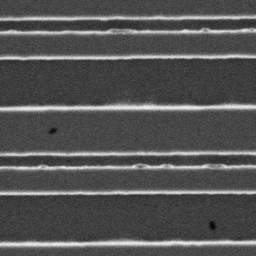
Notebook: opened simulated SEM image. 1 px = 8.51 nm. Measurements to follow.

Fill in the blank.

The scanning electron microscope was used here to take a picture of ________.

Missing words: lines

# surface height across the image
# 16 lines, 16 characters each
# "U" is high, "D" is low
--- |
UUUUUUUUUUUUUUUU
UUUUUUUUUUUUUUUU
UUUUUUUUUUUUUUUU
UUUUUUUUUUUUUUUU
DDDDDDDDDDDDDDDD
DDDDDDDDDDDDDDDD
DDDDDDDDDDDDDDDD
UUUUUUUUUUUUUUUU
UUUUUUUUUUUUUUUU
UUUUUUUUUUUUUUUU
UUUUUUUUUUUUUUUU
UUUUUUUUUUUUUUUU
DDDDDDDDDDDDDDDD
DDDDDDDDDDDDDDDD
DDDDDDDDDDDDDDDD
UUUUUUUUUUUUUUUU